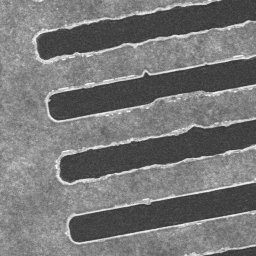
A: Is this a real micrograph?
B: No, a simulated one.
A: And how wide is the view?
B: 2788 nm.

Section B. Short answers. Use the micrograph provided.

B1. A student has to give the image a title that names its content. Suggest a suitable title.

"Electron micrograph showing one or a few lines or trenches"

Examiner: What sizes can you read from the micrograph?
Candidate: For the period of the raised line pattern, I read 0.678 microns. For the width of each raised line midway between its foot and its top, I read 33.7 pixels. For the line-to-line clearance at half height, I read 309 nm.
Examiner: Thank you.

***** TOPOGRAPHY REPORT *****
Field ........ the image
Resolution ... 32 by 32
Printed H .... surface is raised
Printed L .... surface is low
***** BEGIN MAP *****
HHHHHHHHHHHHHHHHHHHHHHHHHHLLLLLL
HHHHHHHHHHHHHHHHHHHLLLLLLLLLLLLL
HHHHHHHHHHHHLLLLLLLLLLLLLLLLLLLL
HHHHHHHHLLLLLLLLLLLLLLLLLLLLHHHH
HHHHHLLLLLLLLLLLLLLLLLLHHHHHHHHH
HHHHHLLLLLLLLLLLLLHHHHHHHHHHHHHH
HHHHHLLLLLLLLHHHHHHHHHHHHHHHHHHH
HHHHHLHHHHHHHHHHHHHHHHHHHHHHHLLL
HHHHHHHHHHHHHHHHHHHHHHHLLLLLLLLL
HHHHHHHHHHHHHHHHHHLLLLLLLLLLLLLL
HHHHHHHHHHHHHLLLLLLLLLLLLLLLLLLL
HHHHHHHHLLLLLLLLLLLLLLLLHHLHHHHH
HHHHHHLLLLLLLLLLLLLHHHHHHHHHHHHH
HHHHHHLLLLLLLLLLHHHHHHHHHHHHHHHH
HHHHHHLLLLLHHHHHHHHHHHHHHHHHHHHH
HHHHHHHHHHHHHHHHHHHHHHHHHHHHHLLL
HHHHHHHHHHHHHHHHHHHHHHHLLLLLLLLL
HHHHHHHHHHHHHHHHHHLLLLLLLLLLLLLL
HHHHHHHHHHHHLLLLLLLLLLLLLLLLLLLH
HHHHHHHHLLLLLLLLLLLLLLLLLLLHHHHH
HHHHHHHLLLLLLLLLLLLLLLHHHHHHHHHH
HHHHHHHLLLLLLLLLHHHHHHHHHHHHHHHH
HHHHHHHHLLLHHHHHHHHHHHHHHHHHHHHH
HHHHHHHHHHHHHHHHHHHHHHHHHHHHLLLL
HHHHHHHHHHHHHHHHHHHHHHHLLLLLLLLL
HHHHHHHHHHHHHHHHHLLLLLLLLLLLLLLL
HHHHHHHHHHHHLLLLLLLLLLLLLLLLLLLH
HHHHHHHHHLLLLLLLLLLLLLLLLLHHHHHH
HHHHHHHHHLLLLLLLLLLLLHHHHHHHHHHH
HHHHHHHHHLLLLLLHHHHHHHHHHHHHHHHH
HHHHHHHHHHHHHHHHHHHHHHHHHHHHHHHH
HHHHHHHHHHHHHHHHHHHHHHHHHHHHLLLL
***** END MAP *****